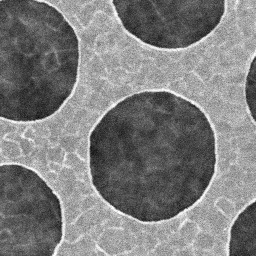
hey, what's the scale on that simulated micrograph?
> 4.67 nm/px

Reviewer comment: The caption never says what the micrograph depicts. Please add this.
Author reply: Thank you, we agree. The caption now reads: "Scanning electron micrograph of holes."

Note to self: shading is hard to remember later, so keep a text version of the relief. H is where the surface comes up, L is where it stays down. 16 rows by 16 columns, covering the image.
LLLHHHHLLLLLLLHH
LLLLHHHHLLLLLLHH
LLLLLHHHHLLLLHHH
LLLLLHHHHHHHHHHH
LLLLLHHHHHHHHHHL
LLLLLHHHHHHHHHHL
LLLLHHHLLLLLHHHL
HLHHHHLLLLLLLHHH
HHHHHHLLLLLLLHHH
HHHHHHLLLLLLLHHH
LLHHHHLLLLLLLHHH
LLLHHHLLLLLLLHHH
LLLLHHHLLLLLHHHH
LLLLHHHHLLLHHHHL
LLLLHHHHHHHHHHLL
LLLHHHHHHHHHHHLL